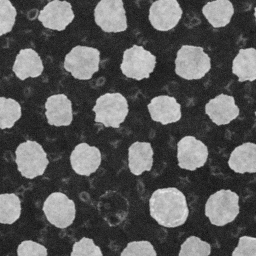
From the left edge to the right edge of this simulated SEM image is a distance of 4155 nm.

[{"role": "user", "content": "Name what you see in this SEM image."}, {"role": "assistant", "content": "a regular array of raised bodies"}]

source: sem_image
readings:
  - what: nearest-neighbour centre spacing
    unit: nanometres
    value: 867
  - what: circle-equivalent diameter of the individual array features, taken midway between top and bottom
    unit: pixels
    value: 32.6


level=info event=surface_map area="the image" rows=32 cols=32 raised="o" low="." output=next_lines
o.....ooo...ooo....ooo....ooo...
oo..ooooo...oooo...oooo..oooo...
oo...oooo...oooo...ooo....ooo...
o.....oo.....ooo...oo...........
................................
................................
...o.....ooo....ooo...oooo....oo
..ooo...oooo...oooo...oooo...ooo
..ooo...oooo...oooo...oooo...ooo
..ooo....oo.....oo.....oo.....oo
................................
................................
oo....ooo...oooo...ooo.....oo...
oo....ooo...oooo...ooo....oooo..
oo....ooo...oooo...oooo...oooo..
oo....ooo....oo............o....
................................
.......................oo.......
..ooo....ooo....ooo...oooo....oo
..oooo...oooo...ooo...oooo...ooo
..oooo...ooo....ooo...ooo....ooo
...oo.....oo.....o............o.
................................
................................
oo....oo..o........oooo...oooo..
oo....ooo..........oooo...oooo..
oo....ooo..........oooo...oooo..
oo....ooo..........oooo...ooo...
................................
................................
...oo....ooo....ooo....ooo....oo
..oooo...oooo..oooo....ooo...ooo